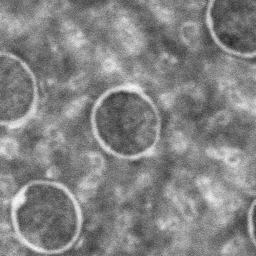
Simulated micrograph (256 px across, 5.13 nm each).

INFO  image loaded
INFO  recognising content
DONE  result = raised bodies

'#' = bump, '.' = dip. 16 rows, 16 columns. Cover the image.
.............###
.............###
.............###
#...............
##..............
##..............
##....####......
#.....####......
......####......
.......##.......
................
..#.............
.####...........
.####...........
.####...........
..##............